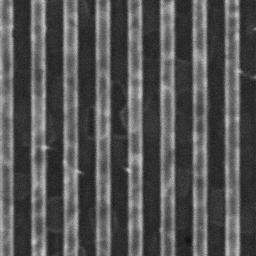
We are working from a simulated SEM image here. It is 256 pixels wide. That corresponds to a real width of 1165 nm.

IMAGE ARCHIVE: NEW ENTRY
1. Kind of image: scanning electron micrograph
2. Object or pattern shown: parallel lines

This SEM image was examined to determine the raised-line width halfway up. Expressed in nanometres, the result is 51.7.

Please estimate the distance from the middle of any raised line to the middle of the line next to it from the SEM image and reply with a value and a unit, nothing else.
147 nanometres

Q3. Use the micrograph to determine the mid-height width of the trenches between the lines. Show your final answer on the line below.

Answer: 94.9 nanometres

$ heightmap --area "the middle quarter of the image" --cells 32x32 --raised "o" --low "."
ooo.....ooo.....ooo......oo.....
ooo.....ooo.....ooo......oo.....
ooo.....ooo.....ooo......oo.....
ooo.....ooo.....ooo......oo.....
ooo.....ooo.....ooo......oo.....
ooo.....ooo.....ooo......oo.....
ooo.....ooo.....ooo......oo.....
ooo.....ooo.....ooo......oo.....
ooo.....ooo.....ooo......oo.....
ooo.....ooo......oo......oo.....
ooo.....ooo......oo......oo.....
ooo.....ooo......oo......oo.....
ooo.....ooo......oo......oo.....
ooo.....ooo......oo......oo.....
ooo.....ooo......oo......oo.....
ooo.....ooo......oo......oo.....
ooo.....ooo......oo......oo.....
ooo.....ooo......oo......oo.....
ooo.....ooo......oo......oo.....
ooo.....ooo......oo......oo.....
ooo.....ooo......oo......oo.....
ooo.....ooo......oo......oo.....
ooo.....ooo......oo......oo.....
ooo.....ooo......oo......oo.....
ooo.....ooo......oo......oo.....
ooo.....ooo......oo......oo.....
ooo.....ooo.....ooo......oo.....
ooo.....ooo......oo......oo.....
ooo.....ooo......oo......oo.....
ooo.....ooo......oo......oo.....
ooo.....ooo......oo......oo.....
ooo.....ooo......oo......oo.....